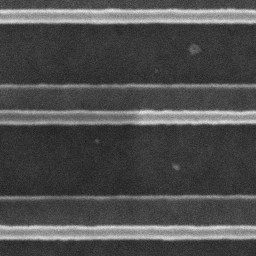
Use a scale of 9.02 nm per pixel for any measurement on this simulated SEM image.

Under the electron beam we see lines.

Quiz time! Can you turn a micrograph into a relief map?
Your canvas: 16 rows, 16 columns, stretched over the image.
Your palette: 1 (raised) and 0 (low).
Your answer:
1111111111111111
0000000000000000
0000000000000000
0000000000000000
0000000000000000
1111111111111111
1111111111111111
1111111111111111
0000000000000000
0000000000000000
0000000000000000
0000000000000000
1111111111111111
1111111111111111
1111111111111111
0000000000000000